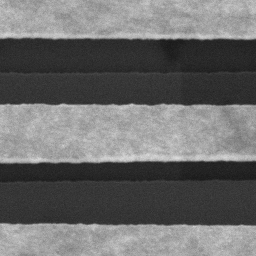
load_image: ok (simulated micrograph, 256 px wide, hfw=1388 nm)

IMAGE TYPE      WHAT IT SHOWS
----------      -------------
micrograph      lines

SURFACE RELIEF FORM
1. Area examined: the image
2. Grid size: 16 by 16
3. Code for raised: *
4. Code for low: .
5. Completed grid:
****************
****************
................
................
................
................
................
****************
****************
****************
................
................
................
................
****************
****************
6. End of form